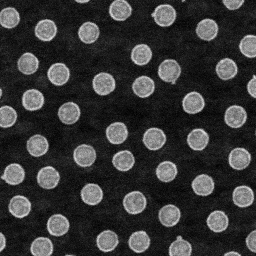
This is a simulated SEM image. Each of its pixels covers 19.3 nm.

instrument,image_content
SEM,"a regular array of raised bodies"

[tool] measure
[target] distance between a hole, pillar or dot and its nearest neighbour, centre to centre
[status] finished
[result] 705 nm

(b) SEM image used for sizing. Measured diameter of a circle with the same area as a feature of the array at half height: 0.4 µm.